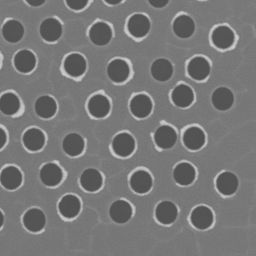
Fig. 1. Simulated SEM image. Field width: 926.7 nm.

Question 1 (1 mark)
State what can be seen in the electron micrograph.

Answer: a regular array of holes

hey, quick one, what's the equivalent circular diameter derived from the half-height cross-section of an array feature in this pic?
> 81.8 nm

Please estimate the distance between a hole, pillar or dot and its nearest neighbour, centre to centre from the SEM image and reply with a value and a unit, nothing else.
0.133 um